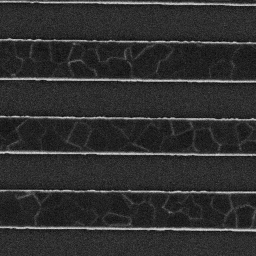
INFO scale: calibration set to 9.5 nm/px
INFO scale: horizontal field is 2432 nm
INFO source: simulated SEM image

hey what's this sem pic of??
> lines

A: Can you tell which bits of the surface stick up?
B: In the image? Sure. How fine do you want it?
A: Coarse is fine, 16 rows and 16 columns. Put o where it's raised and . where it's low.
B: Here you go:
................
................
ooo.............
oooooooooooooooo
oooooooooooooooo
................
................
oooooooooooooooo
oooooooooooooooo
oooooooooooooooo
................
................
oooooooooooooooo
oooooooooooooooo
................
................